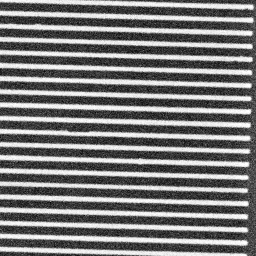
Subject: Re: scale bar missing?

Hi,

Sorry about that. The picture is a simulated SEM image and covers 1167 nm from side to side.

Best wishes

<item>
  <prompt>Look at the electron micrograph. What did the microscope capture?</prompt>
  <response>parallel lines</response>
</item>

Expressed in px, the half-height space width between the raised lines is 10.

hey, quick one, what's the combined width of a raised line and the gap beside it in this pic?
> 59.8 nm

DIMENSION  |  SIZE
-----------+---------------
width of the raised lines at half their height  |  15.4 nanometres